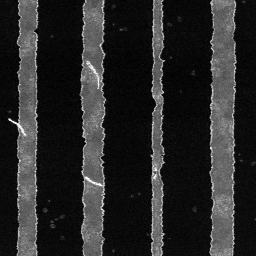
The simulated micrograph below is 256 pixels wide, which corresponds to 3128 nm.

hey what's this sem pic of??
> one or a few lines or trenches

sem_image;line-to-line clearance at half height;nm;597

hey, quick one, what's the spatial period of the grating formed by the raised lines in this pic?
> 795 nanometres